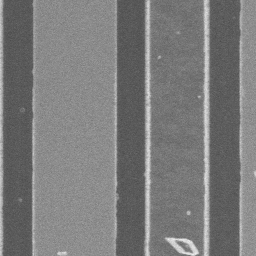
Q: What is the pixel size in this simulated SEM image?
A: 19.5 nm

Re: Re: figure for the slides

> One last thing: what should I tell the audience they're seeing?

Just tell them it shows lines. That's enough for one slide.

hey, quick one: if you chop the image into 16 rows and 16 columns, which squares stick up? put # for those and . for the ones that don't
..#####..####..#
..#####..####..#
..#####..####..#
..#####..####..#
..#####..####..#
..#####..####..#
..#####..####..#
..#####..####..#
..#####..####..#
..#####..####..#
..#####..####..#
..#####..####..#
..#####..####..#
..#####..####..#
..#####..####..#
..#####..####..#